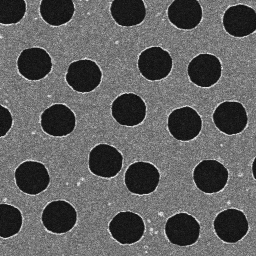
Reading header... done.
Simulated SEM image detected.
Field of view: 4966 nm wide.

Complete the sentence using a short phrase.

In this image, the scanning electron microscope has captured a regular array of holes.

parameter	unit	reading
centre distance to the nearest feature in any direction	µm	0.96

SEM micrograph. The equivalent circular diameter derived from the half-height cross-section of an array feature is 658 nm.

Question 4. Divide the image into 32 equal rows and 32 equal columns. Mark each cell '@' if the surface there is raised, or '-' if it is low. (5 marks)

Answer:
---@@----@@@@@----@@@----@@@@@@@
---@@----@@@@@----@@@----@@@----
---@@@---@@@@@----@@@----@@@----
@@@@@@@@@@@@@@@@@@@@@@--@@@@----
@@@@@@@@@@@@@@@@@@@@@@@@@@@@@--@
@@@@@@@@@@@@@@@@@@@@@@@@@@@@@@@@
@@@---@@@@@@@@@@@@---@@@@@@@@@@@
@@----@@@@-@@@@@@----@@@---@@@@@
@@----@@@---@@@@@----@@@----@@@@
@@@---@@-----@@@@@---@@@----@@@@
@@@@@@@@@---@@@@@@@@@@@@---@@@@@
@@@@@@@@@@-@@@@@@@@@@@@@@@@@@@@@
@@@@@@@@@@@@@@----@@@@@@@@@@@@@@
-@@@@@---@@@@@----@@@@@-@@@----@
-@@@@----@@@@@----@@@----@@----@
--@@@----@@@@@@--@@@@----@@----@
-@@@@@---@@@@@@@@@@@@----@@@--@@
@@@@@@@@@@@@@@@@@@@@@@@@@@@@@@@@
@@@@@@@@@@@@--@@@@@@@@@@@@@@@@@@
@@@@@@@@@@@----@@@@@@@@@@@@@@@@@
@@@--@@@@@@----@@--@@@@@@---@@@@
@@----@@@@@@---@----@@@@----@@@@
@@----@@@@@@@@@@----@@@@----@@@@
@@----@@@@@@@@@@---@@@@@@---@@@@
@@@@@@@@@@@@@@@@@@@@@@@@@@@@@@@@
@@@@@@---@@@@@@@@@@@@@@@@@@@@@@@
---@@-----@@@@@-@@@@@@@@@@@@--@@
---@@-----@@@@----@@@---@@@----@
---@@@---@@@@@----@@@----@@----@
-@@@@@@@@@@@@@----@@@----@@----@
@@@@@@@@@@@@@@@-@@@@@@--@@@@@@@@
@@@@@@@@@@@@@@@@@@@@@@@@@@@@@@@@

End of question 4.